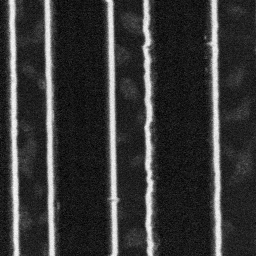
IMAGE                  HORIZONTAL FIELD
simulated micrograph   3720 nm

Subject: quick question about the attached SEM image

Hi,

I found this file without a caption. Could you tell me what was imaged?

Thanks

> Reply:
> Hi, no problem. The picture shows one or a few lines or trenches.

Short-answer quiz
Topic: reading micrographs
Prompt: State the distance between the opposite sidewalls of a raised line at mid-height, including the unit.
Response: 528 nanometres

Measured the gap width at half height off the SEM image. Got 933 nm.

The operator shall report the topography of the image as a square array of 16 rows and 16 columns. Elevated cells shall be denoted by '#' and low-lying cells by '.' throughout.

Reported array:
.##....##....###
.##....##....###
.##....##....###
.##....##....###
.##....##....###
.##....##....###
.##....##....###
.##....##.....##
.##....##....###
.##....##....###
.##....##.....##
.##....##.....##
.##....##.....##
.##....##.....##
.##....##.....##
.##....##.....##